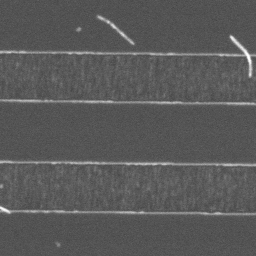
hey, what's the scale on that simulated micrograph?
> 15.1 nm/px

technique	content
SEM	lines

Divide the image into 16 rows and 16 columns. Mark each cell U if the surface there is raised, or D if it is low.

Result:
UUUUUUUUUUUUUUUU
UUUUUUUUUUUUUUUU
UUUUUUUUUUUUUUUU
DDDDDDDDDDDDDDDU
DDDDDDDDDDDDDDDD
DDDDDDDDDDDDDDDD
UUUUUUUUUUUUUUUU
UUUUUUUUUUUUUUUU
UUUUUUUUUUUUUUUU
UUUUUUUUUUUUUUUU
DDDDDDDDDDDDDDDD
DDDDDDDDDDDDDDDD
DDDDDDDDDDDDDDDD
UUUUUUUUUUUUUUUU
UUUUUUUUUUUUUUUU
UUUUUUUUUUUUUUUU